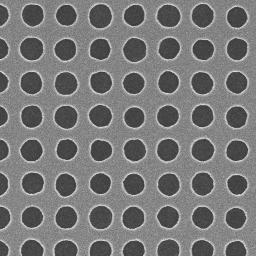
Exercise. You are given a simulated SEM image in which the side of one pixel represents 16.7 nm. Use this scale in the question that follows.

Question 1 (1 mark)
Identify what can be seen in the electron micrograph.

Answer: a regular array of holes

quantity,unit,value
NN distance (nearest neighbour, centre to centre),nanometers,554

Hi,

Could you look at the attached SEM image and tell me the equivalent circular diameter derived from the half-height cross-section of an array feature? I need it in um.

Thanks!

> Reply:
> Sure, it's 0.363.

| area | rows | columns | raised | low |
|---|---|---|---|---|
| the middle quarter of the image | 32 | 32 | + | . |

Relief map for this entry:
++++++++++++++++++++++++++++++++
++++++++++++++++++++++++++++++++
..+++++....+++++...++++++...++++
...++++.....+++.....++++.....+++
...++++.....+++.....++++.....+++
...++++.....+++.....++++.....+++
...++++....++++.....++++....++++
..+++++++.+++++++.++++++++++++++
++++++++++++++++++++++++++++++++
++++++++++++++++++++++++++++++++
..++++++..+++++++++++++++..+++++
...++++....+++++...+++++....++++
...+++......+++.....+++......+++
...+++......+++.....+++......+++
...++++.....+++.....++++....++++
..++++++..++++++...++++++..+++++
++++++++++++++++++++++++++++++++
++++++++++++++++++++++++++++++++
++++++++++++++++++++++++++++++++
...++++....+++++....++++....++++
...++++.....+++.....+++......+++
...++++.....+++.....+++......+++
...++++.....+++.....+++.....++++
..+++++....+++++....++++....++++
++++++++++++++++++++++++++++++++
++++++++++++++++++++++++++++++++
++++++++++++++++++++++++++++++++
.+++++++..+++++++.+++++++..+++++
..+++++....++++....+++++....++++
...+++......+++.....++++.....+++
...+++......+++.....++++.....+++
...++++....++++.....++++.....+++